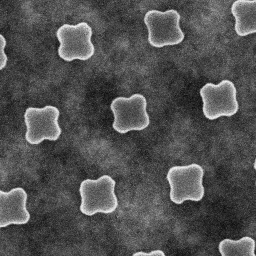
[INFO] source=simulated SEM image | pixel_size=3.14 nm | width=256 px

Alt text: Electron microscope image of raised bodies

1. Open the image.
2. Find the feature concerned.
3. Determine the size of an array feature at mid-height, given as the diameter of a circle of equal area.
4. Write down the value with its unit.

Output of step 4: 118 nm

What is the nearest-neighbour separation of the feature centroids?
279 nanometres